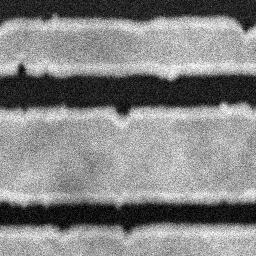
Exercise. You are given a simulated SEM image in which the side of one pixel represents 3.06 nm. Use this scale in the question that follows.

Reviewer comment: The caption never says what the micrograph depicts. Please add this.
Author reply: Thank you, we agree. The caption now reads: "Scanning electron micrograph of one or a few lines or trenches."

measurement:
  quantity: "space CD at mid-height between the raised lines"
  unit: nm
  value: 109